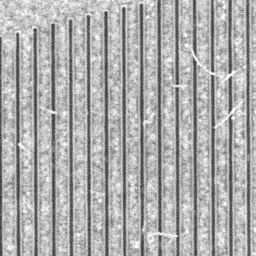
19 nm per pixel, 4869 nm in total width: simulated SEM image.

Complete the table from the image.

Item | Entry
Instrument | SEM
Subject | parallel lines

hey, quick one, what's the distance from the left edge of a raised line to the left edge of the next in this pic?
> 17.7 pixels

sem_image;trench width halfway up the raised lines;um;0.088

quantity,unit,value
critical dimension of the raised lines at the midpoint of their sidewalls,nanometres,247